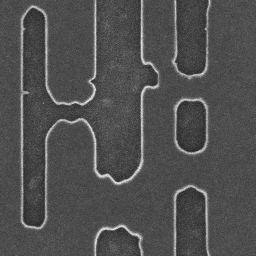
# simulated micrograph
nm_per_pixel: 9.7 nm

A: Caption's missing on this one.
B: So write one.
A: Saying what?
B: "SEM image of one or a few lines or trenches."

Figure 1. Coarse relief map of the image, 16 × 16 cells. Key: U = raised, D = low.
UUUUUUDDDUUDDUUU
UDDUUUDDDUUDDUUU
UDDUUUDDDUUDDUUU
UDDUUUDDDUUDDUUU
UDDUUUDDDDUDDUUU
UDDUUUDDDUUUUUUU
UDDDDDDDDUUDDUUU
UDDDDDDDDUUDDUUU
UDDUUUDDDUUDDUUU
UDDUUUDDDUUUUUUU
UDDUUUDDDUUUUUUU
UDDUUUUUUUUUUUUU
UDDUUUUUUUUDDUUU
UDDUUUUUUUUDDUUU
UUUUUUDDUUUDDUUU
UUUUUUDDDUUDDUUU